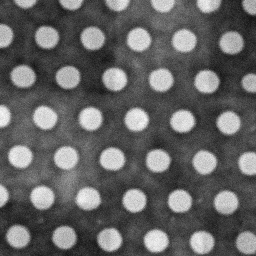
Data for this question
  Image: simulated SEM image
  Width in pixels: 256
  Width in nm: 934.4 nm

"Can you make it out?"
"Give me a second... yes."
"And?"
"a regular array of raised bodies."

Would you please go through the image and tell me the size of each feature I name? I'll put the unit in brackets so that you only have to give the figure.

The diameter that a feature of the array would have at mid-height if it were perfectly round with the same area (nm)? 84.9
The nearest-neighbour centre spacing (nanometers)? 166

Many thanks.